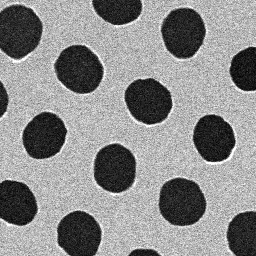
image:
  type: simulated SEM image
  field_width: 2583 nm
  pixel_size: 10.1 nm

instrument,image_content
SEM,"holes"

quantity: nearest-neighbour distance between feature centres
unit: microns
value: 0.756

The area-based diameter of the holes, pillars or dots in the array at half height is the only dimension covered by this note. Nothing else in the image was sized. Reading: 470 nm